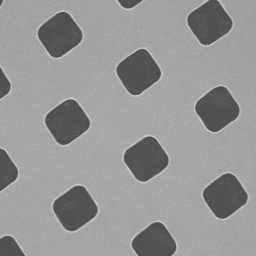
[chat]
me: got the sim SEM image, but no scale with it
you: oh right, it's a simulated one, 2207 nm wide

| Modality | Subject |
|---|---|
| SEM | holes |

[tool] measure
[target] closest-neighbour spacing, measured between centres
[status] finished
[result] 749 nm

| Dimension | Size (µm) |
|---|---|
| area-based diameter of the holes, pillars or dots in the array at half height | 0.357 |